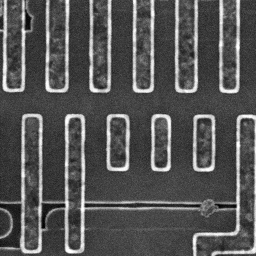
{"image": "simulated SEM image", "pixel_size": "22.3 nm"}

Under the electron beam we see wiring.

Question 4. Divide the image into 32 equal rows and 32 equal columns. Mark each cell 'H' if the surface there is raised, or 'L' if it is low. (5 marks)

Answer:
LHHLLLHHLLLHHHLLLHHLLLHHLLLLHHLL
LHHLLLHHLLLHHHLLLHHLLLHHLLLLHHLL
LHHLLLHHLLLHHHLLLHHLLLHHLLLLHHLL
LHHLLLHHLLLHHHLLLHHLLLHHLLLLHHLL
LHHLLLHHLLLHHHLLLHHLLLHHLLLLHHLL
LHHLLLHHLLLHHHLLLHHLLLHHLLLLHHLL
LHHLLLHHLLLHHHLLLHHLLLHHLLLLHHLL
LHHLLLHHLLLHHHLLLHHLLLHHLLLLHHLL
LHHLLLHHLLLHHHLLLHHLLLHHLLLLHHLL
LHHLLLHHLLLHHHLLLHHLLLHHLLLLHHLL
LHHLLLHHLLLHHHLLLHHLLLHHLLLLHHLL
LLLLLLLLLLLLLLLLLLLLLLLLLLLLLLLL
LLLLLLLLLLLLLLLLLLLLLLLLLLLLLLLL
LLLLLLLLLLLLLLLLLLLLLLLLLLLLLLLL
LLLHHLLLLLLLLLLLLLLLLLLLLLLLLLLL
LLLHHLLLHHLLLLHHLLLHHLLLHHHLLLHH
LLLHHLLLHHLLLLHHLLLHHLLLHHHLLLHH
LLLHHLLLHHLLLLHHLLLHHLLLHHHLLLHH
LLLHHLLLHHLLLLHHLLLHHLLLHHHLLLHH
LLLHHLLLHHLLLLHHLLLHHLLLHHHLLLHH
LLLHHLLLHHLLLLHHLLLHHLLLHHHLLLHH
LLLHHLLLHHLLLLLLLLLLLLLLLLLLLLHH
LLLHHLLLHHLLLLLLLLLLLLLLLLLLLLHH
LLLHHLLLHHLLLLLLLLLLLLLLLLLLLLHH
LLLHHLLLHHLLLLLLLLLLLLLLLLLLLLHH
LLLHHLLLHHLLLLLLLLLLLLLLLLLLLLHH
LLLHHLLLHHLLLLLLLLLLLLLLLLLLLLHH
LLLHHLLLHHLLLLLLLLLLLLLLLLLLLLHH
LLLHHLLLHHLLLLLLLLLLLLLLLLLLLLHH
LLLHHLLLHHLLLLLLLLLLLLLLLHHHHHHH
LLLHHLLLHHLLLLLLLLLLLLLLHHHHHHHH
LLLLLLLLLLLLLLLLLLLLLLLLHHHHHHHL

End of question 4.